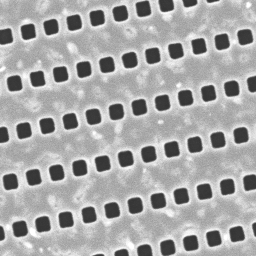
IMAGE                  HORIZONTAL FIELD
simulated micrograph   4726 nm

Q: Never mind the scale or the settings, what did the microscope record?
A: a regular array of holes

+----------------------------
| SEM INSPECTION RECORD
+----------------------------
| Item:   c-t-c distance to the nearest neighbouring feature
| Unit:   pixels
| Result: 23.4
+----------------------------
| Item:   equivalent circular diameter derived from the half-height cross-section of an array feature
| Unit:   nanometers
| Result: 307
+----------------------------